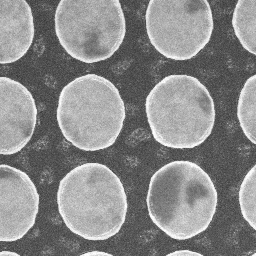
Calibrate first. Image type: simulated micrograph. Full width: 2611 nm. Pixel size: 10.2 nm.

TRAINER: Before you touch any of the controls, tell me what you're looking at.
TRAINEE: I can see raised bodies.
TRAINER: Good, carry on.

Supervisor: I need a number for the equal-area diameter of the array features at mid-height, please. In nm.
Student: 725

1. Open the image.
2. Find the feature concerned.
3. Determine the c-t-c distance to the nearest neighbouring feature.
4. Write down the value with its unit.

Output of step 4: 901 nanometres